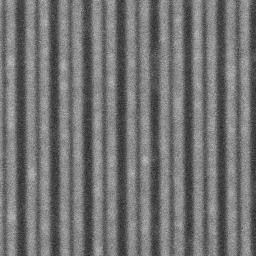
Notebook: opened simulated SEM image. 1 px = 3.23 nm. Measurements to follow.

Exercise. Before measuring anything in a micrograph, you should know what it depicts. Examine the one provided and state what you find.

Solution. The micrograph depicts parallel lines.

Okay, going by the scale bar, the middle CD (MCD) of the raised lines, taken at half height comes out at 0.0271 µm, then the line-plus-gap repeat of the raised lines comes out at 54.1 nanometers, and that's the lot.